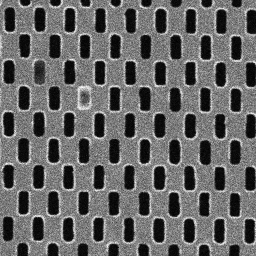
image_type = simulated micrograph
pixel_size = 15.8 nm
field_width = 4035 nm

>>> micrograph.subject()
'a regular array of holes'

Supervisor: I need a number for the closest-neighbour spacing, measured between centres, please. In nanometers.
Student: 470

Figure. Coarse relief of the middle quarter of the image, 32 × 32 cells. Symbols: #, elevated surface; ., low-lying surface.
...#####..#####...#####..#####..
...#####..#####...#####...####..
...#####..#####...#####...####..
...#####..#####...#####...####..
...#####..#####...#####...####..
################################
############..#####...#####..###
###########...#####...####...###
###########...#####...####...###
###########...#####...####...###
###########...#####...####...###
###########...#####..#####...###
..######..######.######..######.
...####...#####...####....####..
...####...#####...####....####..
...####...#####...####....####..
...####...#####...####....####..
..######..#####...#####..#####..
################.##############.
####..#####...#####..#####...###
####..#####...#####...####...###
####..#####...#####...####...###
####..#####...#####...####...###
####..#####...#####...####...###
####..#####...#####..#####...###
..######..#####..######..######.
..#####...#####...#####..#####..
..#####...#####...####...#####..
...####...#####...####...#####..
...####...#####...####...#####..
...####...#####...####...#####..
########.#######.######.#######.